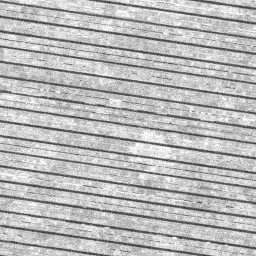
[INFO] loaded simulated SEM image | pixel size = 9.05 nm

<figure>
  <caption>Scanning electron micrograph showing parallel lines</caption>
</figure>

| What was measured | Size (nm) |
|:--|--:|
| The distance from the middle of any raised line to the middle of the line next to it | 66.9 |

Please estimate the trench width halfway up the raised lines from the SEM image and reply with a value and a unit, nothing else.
0.0246 um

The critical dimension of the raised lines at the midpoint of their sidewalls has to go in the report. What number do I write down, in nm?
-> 49.2